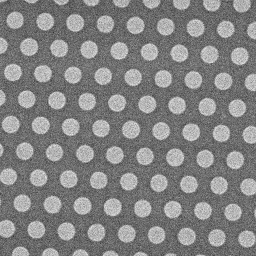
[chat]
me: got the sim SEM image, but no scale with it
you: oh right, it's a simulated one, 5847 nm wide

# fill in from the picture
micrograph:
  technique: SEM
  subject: an array of small figures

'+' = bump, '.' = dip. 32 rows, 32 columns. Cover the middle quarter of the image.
................................
.+++.....++.....................
++++....++++....+++....+++.....+
.+++....++++...++++....++++...++
.++.....+++.....+++....++++...++
........................++.....+
................................
.....+..........................
....++++....+++.....++......+...
....++++...++++....++++...++++..
....+++....++++....++++...++++..
............++.....+++.....+++..
................................
................................
+++.....++......++..............
++++...++++....++++....+++.....+
++++...++++....++++...++++....++
.++.....+++....+++....++++....++
.......................++.....++
................................
.....+..........................
...++++....+++.....++......++...
...++++....++++...++++....++++..
....+++....++++...++++....++++..
............++.....+++....++++..
................................
................................
+++....+++......+...............
+++....++++...++++....+++.....++
+++....++++...++++....++++...+++
++.....+++....++++....++++...+++
.......................++.....++